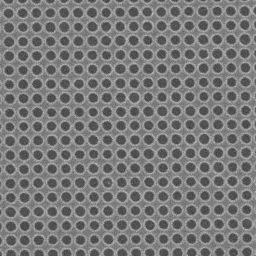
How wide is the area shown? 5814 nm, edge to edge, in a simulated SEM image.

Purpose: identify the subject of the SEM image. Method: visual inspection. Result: a regular array of holes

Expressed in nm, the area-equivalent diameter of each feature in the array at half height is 232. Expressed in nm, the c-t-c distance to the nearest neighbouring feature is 309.